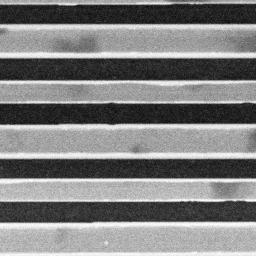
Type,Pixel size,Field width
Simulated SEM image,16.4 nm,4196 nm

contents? lines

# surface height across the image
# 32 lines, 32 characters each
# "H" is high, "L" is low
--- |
LLLLLLLHHHLLLLLLLLLLLLLLLLLLLLLL
LLLLLLLLLLLLLLLLLLLLLLLLLLLLLLLL
LLLLLLLLLLLLLLLLLLLLLLLLLLLLLLLL
HHHHHHHHHHHHHHHHHHHHHHHHHHHHHHHH
HHHHHHHHHHHHHHHHHHHHHHHHHHHHHHHH
HHHHHHHHHHHHHHHHHHHHHHHHHHHHHHHH
HHHHHHHHHHHHHHHHHHHHHHHHHHHHHHHH
LLLLLLLLLLLLLLLLLLLLLLLLLLLLLLLL
LLLLLLLLLLLLLLLLLLLLLLLLLLLLLLLL
LLLLLLLLLLLLLLLLLLLLLLLLLLLLLLLL
HHHHHHHHHHHHHHHHHHHHHHHHHHHHHHHH
HHHHHHHHHHHHHHHHHHHHHHHHHHHHHHHH
HHHHHHHHHHHHHHHHHHHHHHHHHHHHHHHH
LLLLLLLLLLLLLLLLLLLLLLLLLLLLLLLL
LLLLLLLLLLLLLLLLLLLLLLLLLLLLLLLL
LLLLLLLLLLLLLLLLLLLLLLLLLLLLLLLL
HHHHHHHHHHHHHHHHHHHHHHHHHHHHHHHH
HHHHHHHHHHHHHHHHHHHHHHHHHHHHHHHH
HHHHHHHHHHHHHHHHHHHHHHHHHHHHHHHH
HHHHHHHHHHHHHHHHHHHHHHHHHHHHHHHH
LLLLLLLLLLLLLLLLLLLLLLLLLLLLLLLL
LLLLLLLLLLLLLLLLLLLLLLLLLLLLLLLL
LLLLLHHHHHHHHHHHHHHHHHLHHHHHLHHH
HHHHHHHHHHHHHHHHHHHHHHHHHHHHHHHH
HHHHHHHHHHHHHHHHHHHHHHHHHHHHHHHH
LLLLLLLLLLLLLLLLLLLLLLLLLLLLLLLL
LLLLLLLLLLLLLLLLLLLLLLLLLLLLLLLL
LLLLLLLLLLLLLLLLLLLLLLLLLLLLLLLL
HHHHHHHHHHHHHHHHHHHHHHHHHHHHHHHH
HHHHHHHHHHHHHHHHHHHHHHHHHHHHHHHH
HHHHHHHHHHHHHHHHHHHHHHHHHHHHHHHH
HHHHHHHHHHHHHHHHHHHHHHHHHHHHHHHH